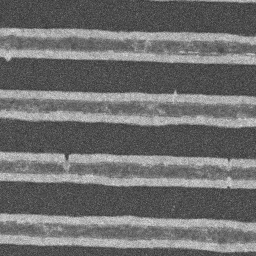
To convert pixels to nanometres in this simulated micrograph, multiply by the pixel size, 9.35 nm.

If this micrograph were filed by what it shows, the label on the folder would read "one or a few lines or trenches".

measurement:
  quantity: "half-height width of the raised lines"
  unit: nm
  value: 193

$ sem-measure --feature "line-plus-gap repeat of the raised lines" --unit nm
580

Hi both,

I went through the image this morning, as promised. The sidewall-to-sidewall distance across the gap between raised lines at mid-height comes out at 0.386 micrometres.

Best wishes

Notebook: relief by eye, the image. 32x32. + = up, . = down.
................................
................................
................................
................................
++++++++++++++..+...............
++++++++++++++++++++++++++++++++
++++++++++++++++++++++++++++++++
................................
................................
................................
................................
................................
++++++++++++++++++++++++++......
++++++++++++++++++++++++++++++++
....+..+++++++++++++++++++++++++
................................
................................
................................
................................
................................
++++++++++++++++++++++++++++....
++++++++++++++++++++++++++++++++
.............+++++++++++++++++++
................................
................................
................................
................................
++++++..........................
++++++++++++++++++++++++++++++++
++++++++++++++++++++++++++++++++
........................++++++++
................................